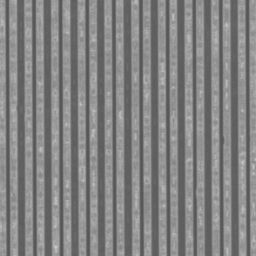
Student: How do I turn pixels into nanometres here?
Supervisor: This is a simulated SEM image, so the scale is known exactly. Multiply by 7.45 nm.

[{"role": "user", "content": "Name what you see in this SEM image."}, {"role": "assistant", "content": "parallel lines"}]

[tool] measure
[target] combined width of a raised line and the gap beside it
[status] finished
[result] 100 nanometers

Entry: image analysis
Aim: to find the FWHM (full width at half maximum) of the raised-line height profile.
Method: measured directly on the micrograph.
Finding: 59.6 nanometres